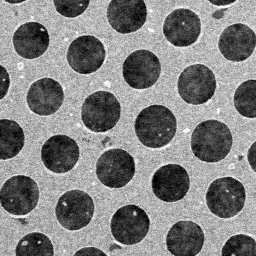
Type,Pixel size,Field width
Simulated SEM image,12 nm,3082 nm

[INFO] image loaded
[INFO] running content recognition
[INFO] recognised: a regular array of holes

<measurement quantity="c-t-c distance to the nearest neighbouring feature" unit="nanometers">686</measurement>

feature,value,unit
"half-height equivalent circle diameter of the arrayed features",488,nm